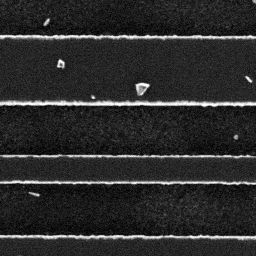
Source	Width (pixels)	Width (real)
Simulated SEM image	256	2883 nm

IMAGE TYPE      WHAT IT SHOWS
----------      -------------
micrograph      lines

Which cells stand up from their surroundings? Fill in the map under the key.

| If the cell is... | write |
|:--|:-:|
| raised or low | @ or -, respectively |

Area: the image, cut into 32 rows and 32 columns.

--------------------------------
--------------------------------
--------------------------------
--------------------------------
@@@@@@@@@@@@-@-@--@@-@--@@-----@
@@@@@@@@@@@@@@@@@@@@@@@@@@@@@@@@
@@@@@@@@@@@@@@@@@@@@@@@@@@@@@@@@
@@@@@@@@@@@@@@@@@@@@@@@@@@@@@@@@
@@@@@@@@@@@@@@@@@@@@@@@@@@@@@@@@
@@@@@@@@@@@@@@@@@@@@@@@@@@@@@@@@
@@@@@@@@@@@@@@@@@@@@@@@@@@@@@@@@
@@@@@@@@@@@@@@@@@@@@@@@@@@@@@@@@
@@@@@@@@@@@@@@@@@@@@@@@@@@@@@@@@
--------------------------------
--------------------------------
--------------------------------
--------------------------------
--------------------------------
--------------------------------
@@@@@@@@@@@@@@@@@-@@-@@@-@@-@-@@
@@@@@@@@@@@@@@@@@@@@@@@@@@@@@@@@
@@@@@@@@@@@@@@@@@@@@@@@@@@@@@@@@
@@@@@@@@@@@@@@@@@@@@@@@@@@@@@@@@
--------------------------------
--------------------------------
--------------------------------
--------------------------------
--------------------------------
--------------------------------
@@@@@@@@@-@@@-@@@@---@-@-@------
@@@@@@@@@@@@@@@@@@@@@@@@@@@@@@@@
@@@@@@@@@@@@@@@@@@@@@@@@@@@@@@@@